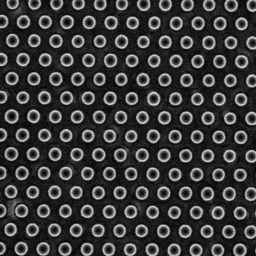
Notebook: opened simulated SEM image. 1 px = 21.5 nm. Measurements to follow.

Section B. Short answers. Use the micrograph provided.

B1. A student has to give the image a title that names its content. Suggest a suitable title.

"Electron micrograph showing a regular array of raised bodies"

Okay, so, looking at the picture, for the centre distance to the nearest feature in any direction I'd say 465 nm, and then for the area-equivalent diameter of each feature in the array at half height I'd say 259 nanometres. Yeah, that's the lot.